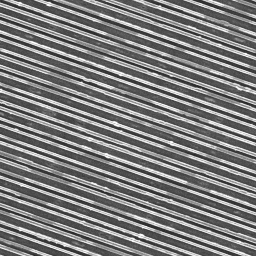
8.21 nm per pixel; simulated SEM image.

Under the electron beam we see parallel lines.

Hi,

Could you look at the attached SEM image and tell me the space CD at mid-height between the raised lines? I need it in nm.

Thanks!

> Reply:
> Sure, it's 50.4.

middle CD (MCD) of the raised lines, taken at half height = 2.72 pixels